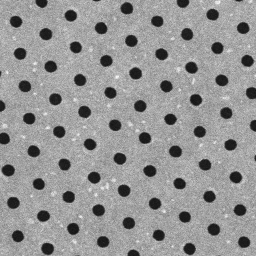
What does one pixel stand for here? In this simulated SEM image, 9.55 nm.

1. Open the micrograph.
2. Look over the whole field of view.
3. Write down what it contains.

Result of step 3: a regular array of holes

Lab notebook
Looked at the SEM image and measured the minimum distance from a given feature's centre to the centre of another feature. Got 304 nanometres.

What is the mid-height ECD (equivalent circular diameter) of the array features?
117 nm